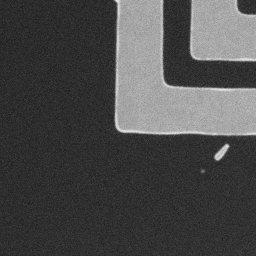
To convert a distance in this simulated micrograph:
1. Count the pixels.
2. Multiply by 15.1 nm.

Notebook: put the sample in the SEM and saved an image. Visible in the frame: groups of lines, slits or small figures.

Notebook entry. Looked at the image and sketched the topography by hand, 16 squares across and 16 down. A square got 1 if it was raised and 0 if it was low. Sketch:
0000000111001110
0000000111001111
0000000111001111
0000000111001111
0000000111000000
0000000111111000
0000000111111111
0000000111111111
0000000000000000
0000000000000000
0000000000000000
0000000000000000
0000000000000000
0000000000000000
0000000000000000
0000000000000000